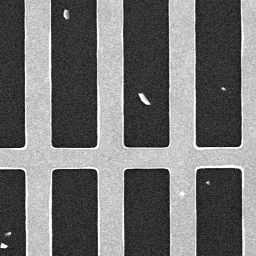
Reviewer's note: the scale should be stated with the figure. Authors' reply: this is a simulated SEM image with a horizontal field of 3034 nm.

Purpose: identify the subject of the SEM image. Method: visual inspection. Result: groups of lines, slits or small figures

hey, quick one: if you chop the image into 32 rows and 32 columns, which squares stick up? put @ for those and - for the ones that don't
---@@@------@@@------@@@------@@
---@@@------@@@------@@@------@@
---@@@------@@@------@@@------@@
---@@@------@@@------@@@------@@
---@@@------@@@------@@@------@@
---@@@------@@@------@@@------@@
---@@@------@@@------@@@------@@
---@@@------@@@------@@@------@@
---@@@------@@@------@@@------@@
---@@@------@@@------@@@------@@
---@@@------@@@------@@@------@@
---@@@------@@@------@@@------@@
---@@@------@@@------@@@------@@
---@@@------@@@------@@@------@@
---@@@------@@@------@@@------@@
---@@@------@@@------@@@------@@
---@@@------@@@------@@@------@@
---@@@------@@@------@@@------@@
---@@@@-----@@@@@---@@@@@--@@@@@
@@@@@@@@@@@@@@@@@@@@@@@@@@@@@@@@
@@@@@@@@@@@@@@@@@@@@@@@@@@@@@@@@
---@@@@-----@@@@-----@@@@-----@@
---@@@------@@@------@@@------@@
---@@@------@@@------@@@------@@
---@@@------@@@------@@@------@@
---@@@------@@@------@@@------@@
---@@@------@@@------@@@------@@
---@@@------@@@------@@@------@@
---@@@------@@@------@@@------@@
---@@@------@@@------@@@-------@
---@@@------@@@------@@@-------@
---@@@------@@@------@@@------@@